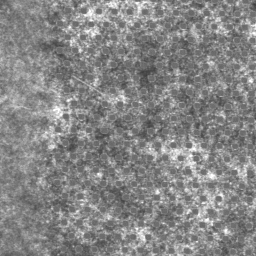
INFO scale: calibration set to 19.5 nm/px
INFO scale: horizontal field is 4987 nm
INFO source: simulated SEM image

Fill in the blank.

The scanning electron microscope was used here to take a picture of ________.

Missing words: a regular array of raised bodies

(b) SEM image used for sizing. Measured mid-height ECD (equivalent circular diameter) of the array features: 137 nm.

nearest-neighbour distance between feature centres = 293 nm